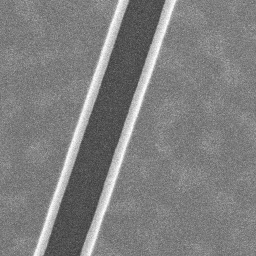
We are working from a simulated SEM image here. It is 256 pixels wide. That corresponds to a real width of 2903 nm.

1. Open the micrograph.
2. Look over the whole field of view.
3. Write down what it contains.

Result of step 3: one or a few lines or trenches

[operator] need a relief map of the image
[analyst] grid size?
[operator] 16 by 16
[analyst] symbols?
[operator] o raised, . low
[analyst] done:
oooooooo...ooooo
ooooooo...oooooo
ooooooo...oooooo
ooooooo..ooooooo
oooooo...ooooooo
oooooo...ooooooo
oooooo...ooooooo
ooooo...oooooooo
ooooo...oooooooo
ooooo..ooooooooo
oooo...ooooooooo
oooo...ooooooooo
oooo...ooooooooo
ooo...oooooooooo
ooo...oooooooooo
ooo...oooooooooo